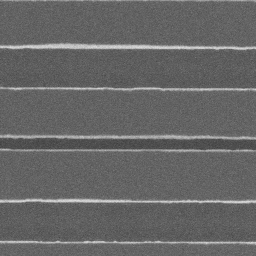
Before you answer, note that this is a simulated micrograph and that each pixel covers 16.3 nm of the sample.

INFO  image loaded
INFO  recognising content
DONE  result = lines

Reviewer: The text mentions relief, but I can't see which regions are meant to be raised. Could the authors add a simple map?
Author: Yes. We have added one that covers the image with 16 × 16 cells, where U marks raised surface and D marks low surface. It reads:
UUUUUUUUUUUUUUUU
UUUUUUUUUUUUUUUU
UUUUUUUUUUUUUUUU
DDDDDDDDDDDDDDDD
DDDDDDDDDDDDDDDD
DDDDDDDDDDDDDDDD
UUUUUUUUUUUUUUUU
UUUUUUUUUUUUUUUU
UUUUUUUUUUUUUUUU
UUUUUUUUUUUUUUUU
UUUUUUUUUUUUUUUU
UUUUUUUUUUUUUUUU
UUUUUUUUUUUUUUUU
DDDDDDDDDDDDDDDD
DDDDDDDDDDDDDDDD
UUUUUUUUUUUUUUUU